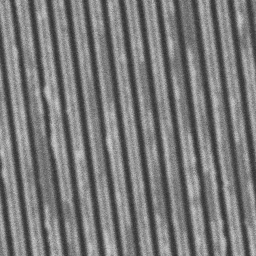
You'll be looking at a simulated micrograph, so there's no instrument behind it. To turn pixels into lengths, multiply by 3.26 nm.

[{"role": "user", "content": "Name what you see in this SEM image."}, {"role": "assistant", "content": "parallel lines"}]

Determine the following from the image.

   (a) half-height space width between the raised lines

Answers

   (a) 8.53 pixels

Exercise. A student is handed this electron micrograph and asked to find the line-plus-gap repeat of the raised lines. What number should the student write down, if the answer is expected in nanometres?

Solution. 58.7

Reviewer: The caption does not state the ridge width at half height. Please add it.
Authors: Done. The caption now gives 30.6 nm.